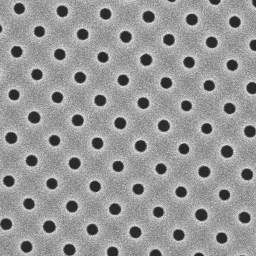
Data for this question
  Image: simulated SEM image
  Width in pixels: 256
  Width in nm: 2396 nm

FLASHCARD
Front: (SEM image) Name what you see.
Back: a regular array of holes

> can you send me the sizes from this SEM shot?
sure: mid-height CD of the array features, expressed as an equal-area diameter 12.1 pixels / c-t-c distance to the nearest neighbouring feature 284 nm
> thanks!